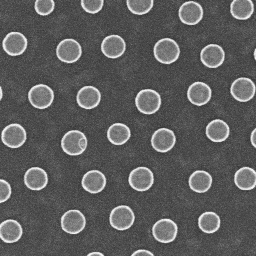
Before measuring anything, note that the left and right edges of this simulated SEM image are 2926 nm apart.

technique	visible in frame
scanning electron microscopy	a regular array of raised bodies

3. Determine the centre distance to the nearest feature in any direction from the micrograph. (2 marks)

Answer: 506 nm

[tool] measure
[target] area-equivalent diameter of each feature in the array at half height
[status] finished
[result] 0.26 microns